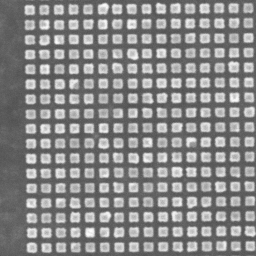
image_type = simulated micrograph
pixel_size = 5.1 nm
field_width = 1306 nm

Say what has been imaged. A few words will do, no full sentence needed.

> a regular array of raised bodies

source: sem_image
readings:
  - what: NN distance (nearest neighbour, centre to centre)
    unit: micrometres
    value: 0.0727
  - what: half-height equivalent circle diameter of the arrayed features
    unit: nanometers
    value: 50.5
